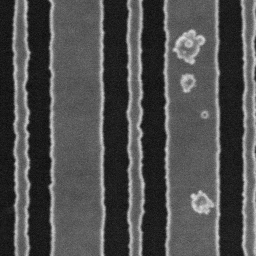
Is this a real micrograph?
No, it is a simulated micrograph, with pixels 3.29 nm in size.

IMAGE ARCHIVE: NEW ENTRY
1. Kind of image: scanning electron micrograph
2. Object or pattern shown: lines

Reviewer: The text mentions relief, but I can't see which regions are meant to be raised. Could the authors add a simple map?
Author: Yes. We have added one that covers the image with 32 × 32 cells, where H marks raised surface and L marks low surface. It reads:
LLHLLLHHHHHHHLLLHHLLLHHHHHHLLLHH
LLHLLLHHHHHHHLLLHHLLLHHHHHHLLLHH
LLHLLLHHHHHHHLLLHHLLLHHHHHHLLLHH
LLHLLLHHHHHHHLLLHHLLLHHHHHHLLLHH
LLHLLLHHHHHHHLLLHHLLLHHHHHHLLLHH
LLHLLLHHHHHHHLLLHHLLLHHHHHHLLLHH
LLHHLLHHHHHHHLLLHHLLLHHHHHHLLLLH
LLHHLLHHHHHHHLLLHHLLLHHHHHHLLLHH
LLHLLLHHHHHHHLLLHHLLLHHHHHHLLLHH
LLHLLLHHHHHHHLLLHHLLLHHHHHHLLLLH
LLHLLLHHHHHHHLLLHHLLLHHHHHHLLLLH
LLHLLLHHHHHHHLLLHHLLLHHHHHHLLLHH
LLHLLLHHHHHHHLLLHHLLLHHHHHHLLLHH
LLHHLLHHHHHHHLLLHHLLLHHHHHHLLLHH
LLHHLLHHHHHHHLLLHHLLLHHHHHHLLLLH
LLHLLLHHHHHHHLLLHHLLLHHHHHHLLLLH
LLHHLLHHHHHHHLLLHHLLLHHHHHHLLLLH
LLHHLLHHHHHHHLLLHHLLLHHHHHHLLLHH
LLHHLLHHHHHHHLLLHHLLLHHHHHHLLLHH
LLHHLLHHHHHHHLLLHHLLLHHHHHHLLLHH
LLHHLLHHHHHHHLLLHHLLLHHHHHHLLLLH
LLHHLLHHHHHHHLLLHHLLLHHHHHHLLLHH
LLHHLLHHHHHHHLLLHHLLLHHHHHHLLLLH
LLHHLLHHHHHHHLLLHHLLLHHHHHHLLLLH
LLHHLLHHHHHHHLLLHHLLLHHHHHHLLLHH
LLHHLLHHHHHHHLLLHHLLLHHHHHHLLLHH
LLHLLLHHHHHHHLLLHHLLLHHHHHHLLLHH
LLHHLLHHHHHHHLLLHHLLLHHHHHHLLLHH
LLHHLLHHHHHHHLLLHHLLLHHHHHHLLLHH
LLHLLLLHHHHHHLLLHHLLLHHHHHHLLLHH
LLHHLLHHHHHHHLLLHHLLLHHHHHHLLLHH
LLHHLLHHHHHHHLLLHHLLLHHHHHHLLLHH